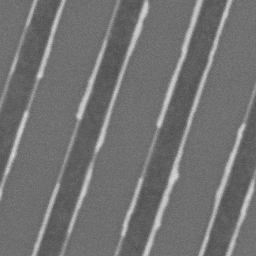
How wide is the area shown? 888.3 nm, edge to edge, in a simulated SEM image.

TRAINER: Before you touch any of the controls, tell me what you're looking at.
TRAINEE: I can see one or a few lines or trenches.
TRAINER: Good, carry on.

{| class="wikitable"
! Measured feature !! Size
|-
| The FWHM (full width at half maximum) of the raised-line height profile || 108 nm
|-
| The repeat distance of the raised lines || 273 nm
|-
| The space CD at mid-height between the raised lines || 0.165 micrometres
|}